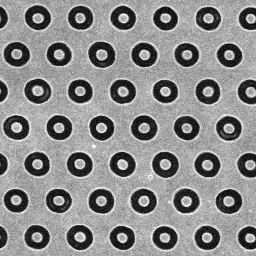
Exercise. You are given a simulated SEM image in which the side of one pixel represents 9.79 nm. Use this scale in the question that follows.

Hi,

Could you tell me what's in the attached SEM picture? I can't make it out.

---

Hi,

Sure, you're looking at a regular array of ring-shaped grooves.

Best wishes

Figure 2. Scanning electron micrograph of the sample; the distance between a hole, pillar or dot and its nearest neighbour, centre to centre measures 42 pixels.